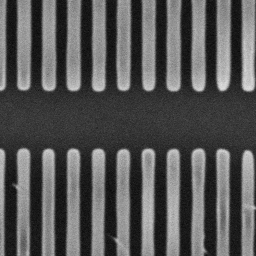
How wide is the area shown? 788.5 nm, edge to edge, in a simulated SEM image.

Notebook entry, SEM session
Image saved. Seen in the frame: wiring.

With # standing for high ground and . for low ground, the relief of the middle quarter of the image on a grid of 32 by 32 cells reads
.###...###...###....###...###...
.###...###...###....###...###...
.###...###....##....###...###...
.###...###....##....###...###...
.###...###....##....###...###...
.###...###....##....###...###...
.###....##....##....##....###...
................................
................................
................................
................................
................................
................................
................................
................................
................................
................................
................................
................................
................................
................................
.##.....##....##....##.....#....
.###...###....##....###...###...
.###...###...###....###...###...
.###...###...###....###...###...
.###...###...###....###...###...
.###...###...###....###...###...
.###...###...###....###...###...
.###...###...###....##....###...
.###...###...###....##....###...
.###...###...###....##....###...
.###...###...###....##....###...